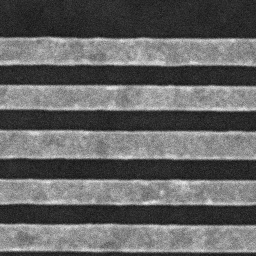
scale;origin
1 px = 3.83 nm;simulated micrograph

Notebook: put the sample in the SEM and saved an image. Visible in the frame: wiring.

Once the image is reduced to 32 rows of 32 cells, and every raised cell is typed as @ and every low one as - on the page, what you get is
--------------------------------
--------------------------------
--------------------------------
--------------------------------
--------------------------------
@@@@@@@@@@@@@@@@@@@@@@@@@@@@@@@@
@@@@@@@@@@@@@@@@@@@@@@@@@@@@@@@@
@@@@@@@@@@@@@@@@@@@@@@@@@@@@@@@@
--------------------------------
--------------------------------
--------------------------------
@@@@@@@@@@@@@@@@@@@@@@@@@@@@@@@@
@@@@@@@@@@@@@@@@@@@@@@@@@@@@@@@@
@@@@@@@@@@@@@@@@@@@@@@@@@@@@@@@@
--------------------------------
--------------------------------
@@@@@@@@@@@---------------------
@@@@@@@@@@@@@@@@@@@@@@@@@@@@@@@@
@@@@@@@@@@@@@@@@@@@@@@@@@@@@@@@@
@@@@@@@@@@@@@@@@@@@@@@@@@@@@@@@@
--------------------------------
--------------------------------
@--@----------------------------
@@@@@@@@@@@@@@@@@@@@@@@@@@@@@@@@
@@@@@@@@@@@@@@@@@@@@@@@@@@@@@@@@
--------------@@-----@@---@@@@@@
--------------------------------
--------------------------------
@@@@@@@@@@@@@@@@@@@@@@@@@@@@@@@@
@@@@@@@@@@@@@@@@@@@@@@@@@@@@@@@@
@@@@@@@@@@@@@@@@@@@@@@@@@@@@@@@@
--------------------------------